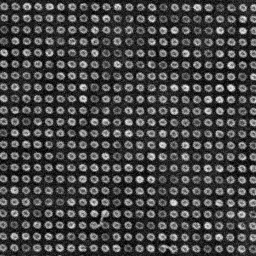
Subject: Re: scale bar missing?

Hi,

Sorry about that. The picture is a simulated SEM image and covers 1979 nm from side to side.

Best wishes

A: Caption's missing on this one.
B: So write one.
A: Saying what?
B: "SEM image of a regular array of raised bodies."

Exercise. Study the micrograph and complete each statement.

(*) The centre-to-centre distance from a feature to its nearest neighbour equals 0.0866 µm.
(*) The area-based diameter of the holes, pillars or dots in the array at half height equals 52.4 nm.